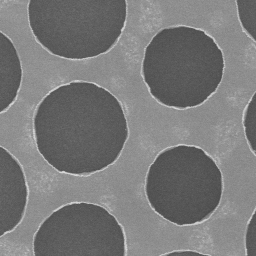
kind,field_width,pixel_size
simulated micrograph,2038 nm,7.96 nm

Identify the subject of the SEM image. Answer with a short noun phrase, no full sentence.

holes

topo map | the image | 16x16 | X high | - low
XX------XXXXXXX-
XX------XXXXXXX-
-X-----XXX---XXX
-XXX--XXX-----XX
-XXXXXXXX-----XX
-XXX--XXX----XXX
-XX----XXX--XXXX
XX------XXXXXXX-
XX------XXXXXXX-
XXX-----XX---XXX
-XX---XXX-----XX
--XXXXXXX-----XX
--XXXXXXX-----XX
-XX----XXX---XXX
XX------XXXXXXX-
XX------XXXXXXX-